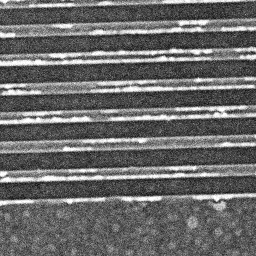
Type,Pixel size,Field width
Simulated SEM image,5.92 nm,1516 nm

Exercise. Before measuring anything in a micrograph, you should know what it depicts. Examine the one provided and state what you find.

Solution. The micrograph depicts parallel lines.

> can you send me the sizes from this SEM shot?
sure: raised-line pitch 172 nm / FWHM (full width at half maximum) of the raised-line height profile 63.6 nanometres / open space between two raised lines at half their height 0.104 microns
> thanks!